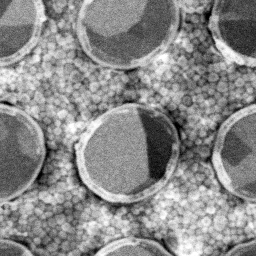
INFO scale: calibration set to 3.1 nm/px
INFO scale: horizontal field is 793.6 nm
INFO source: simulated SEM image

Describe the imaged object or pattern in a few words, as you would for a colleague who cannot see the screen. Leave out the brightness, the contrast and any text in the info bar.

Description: raised bodies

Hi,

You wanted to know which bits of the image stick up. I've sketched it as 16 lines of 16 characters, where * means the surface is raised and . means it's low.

***..******..***
***..******..***
**...******..***
*.....****....**
................
................
................
**....*****...**
***..******...**
***..******..***
**...******...**
**...*****....**
.......**.......
................
................
*......***.....*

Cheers